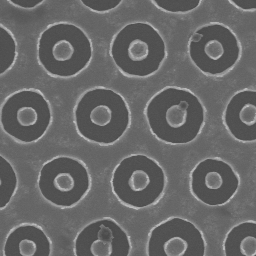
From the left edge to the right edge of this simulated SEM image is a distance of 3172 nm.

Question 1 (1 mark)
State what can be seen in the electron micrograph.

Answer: a regular array of ring-shaped grooves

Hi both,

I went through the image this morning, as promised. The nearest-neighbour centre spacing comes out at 921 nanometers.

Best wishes